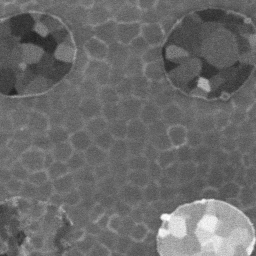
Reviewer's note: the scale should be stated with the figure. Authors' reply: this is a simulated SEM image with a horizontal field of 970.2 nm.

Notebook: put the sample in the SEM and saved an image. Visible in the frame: raised bodies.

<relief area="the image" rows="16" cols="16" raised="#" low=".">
.............#..
####.......#####
#####.....######
#####.....######
####......######
###........####.
................
................
................
................
................
................
................
..........#####.
..........######
..........######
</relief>